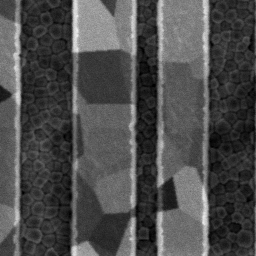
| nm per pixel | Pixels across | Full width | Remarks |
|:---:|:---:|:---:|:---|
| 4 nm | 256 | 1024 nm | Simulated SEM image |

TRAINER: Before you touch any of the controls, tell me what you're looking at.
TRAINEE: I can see one or a few lines or trenches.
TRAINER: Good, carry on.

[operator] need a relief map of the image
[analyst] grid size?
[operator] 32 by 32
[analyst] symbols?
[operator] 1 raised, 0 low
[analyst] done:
11000000011111111000111111000000
11000000011111111000111111000000
11000000011111111000111111000000
11000000011111111000111111000000
11000000011111111000111111000000
11000000011111111000111111000000
11000000011111111000111111000000
11000000011111111000111111000000
11000000011111111000111111000000
11000000011111111000111111000000
11000000011111111000111111000000
11000000011111111000111111000000
11000000011111111000111111000000
11000000011111111000111111000000
11000000011111111000111111000000
11000000011111111000111111000000
11000000011111111000111111000000
11000000011111111000111111000000
11000000011111111000111111000000
11000000011111111000111111000000
11000000011111111000111111000000
11000000011111111000111111000000
11000000011111111000111111000000
11000000011111111000111111000000
11000000011111111000111111000000
11000000011111111000111111000000
11000000011111111000111111000000
11000000011111111000111111000000
11000000011111111000111111000000
11001000011111111000111111000010
11000000011111111000111111000010
11000000011111111000111111000000